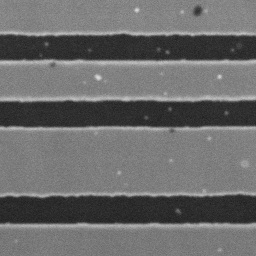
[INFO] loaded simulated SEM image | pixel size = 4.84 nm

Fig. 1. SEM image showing lines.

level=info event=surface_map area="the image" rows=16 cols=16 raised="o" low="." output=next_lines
oooooooooooooooo
oooooooooooooooo
................
................
oooooooooooooooo
oooooooooooooooo
................
................
oooooooooooooooo
oooooooooooooooo
oooooooooooooooo
oooooooooooooooo
................
................
oooooooooooooooo
oooooooooooooooo